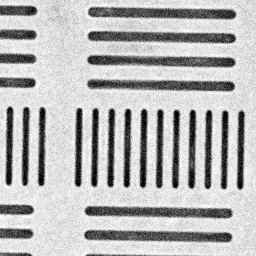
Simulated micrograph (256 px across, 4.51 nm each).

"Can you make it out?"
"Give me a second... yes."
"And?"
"groups of lines, slits or small figures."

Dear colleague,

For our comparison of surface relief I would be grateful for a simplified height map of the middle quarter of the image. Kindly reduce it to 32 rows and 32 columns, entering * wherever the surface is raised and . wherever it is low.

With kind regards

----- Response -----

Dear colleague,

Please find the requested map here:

*******.........................
********************************
********************************
********************************
******..........................
******..........................
************....................
********************************
********************************
********************************
********************************
***..**..**..**..***.**..***.***
***..**..**..**..**..**..**..**.
***..**..**..**..**..**..**..**.
***..**..**..**..**..**..**..**.
***..**..**..**..**..**..**..**.
***..**..**..**..**..**..**..**.
***..**..**..**..**..**..**..**.
***..**..**..**..**..**..**..**.
***..**..**..**..**..**..**..**.
***..**..**..**..**..**..**..**.
***..**..**..**..**..**..**..**.
***..**..**..**..**..**..**..**.
***..**..**..**..**..**..**..**.
***..**..**..**..**..**..**..**.
***..**..**..**..**..**..**..**.
***..**..**..**..**..**..**..**.
***..**..**..**..**..**..**..**.
***..*...**..**..**..**..**..**.
***..*...**..**..**..**..**..**.
***.***.***.***.***..**..**..**.
********************************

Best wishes